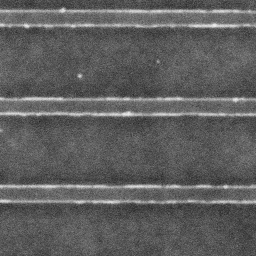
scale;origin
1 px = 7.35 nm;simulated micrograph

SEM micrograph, lines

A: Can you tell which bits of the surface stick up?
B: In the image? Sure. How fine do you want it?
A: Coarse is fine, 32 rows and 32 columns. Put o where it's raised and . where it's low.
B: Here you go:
................................
oooooooooooooooooooooooooooooooo
oooooooooooooooooooooooooooooooo
................................
................................
................................
................................
................................
................................
................................
................................
................................
oooooooooooooooooooooooooooooooo
oooooooooooooooooooooooooooooooo
................................
................................
................................
................................
................................
................................
................................
................................
................................
oooooooooooooooooooooooooooooooo
oooooooooooooooooooooooooooooooo
................................
................................
................................
................................
................................
................................
................................